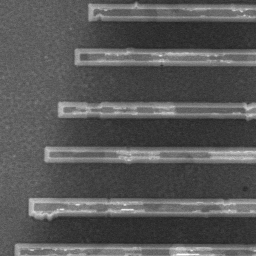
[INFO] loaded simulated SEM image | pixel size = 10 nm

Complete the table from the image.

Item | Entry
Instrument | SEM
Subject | parallel lines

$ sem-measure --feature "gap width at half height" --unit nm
325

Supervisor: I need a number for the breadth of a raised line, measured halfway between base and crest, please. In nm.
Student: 130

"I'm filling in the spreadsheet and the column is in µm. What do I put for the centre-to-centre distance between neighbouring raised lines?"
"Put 0.492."